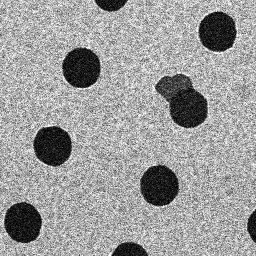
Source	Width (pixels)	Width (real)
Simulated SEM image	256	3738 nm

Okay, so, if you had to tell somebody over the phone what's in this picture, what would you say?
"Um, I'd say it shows holes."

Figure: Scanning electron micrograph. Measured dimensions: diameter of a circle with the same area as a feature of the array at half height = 583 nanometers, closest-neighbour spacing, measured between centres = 82.4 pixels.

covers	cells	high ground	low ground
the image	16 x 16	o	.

oooooo..oooooooo
ooooooooooooo..o
ooooooooooooo..o
oooo..oooooooooo
oooo..oooooooooo
oooooooooo..oooo
oooooooooo...ooo
ooooooooooo..ooo
oo..oooooooooooo
oo..oooooooooooo
ooooooooo.oooooo
ooooooooo..ooooo
ooooooooo..ooooo
..oooooooooooooo
..oooooooooooooo
ooooooo..ooooooo